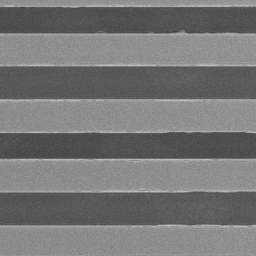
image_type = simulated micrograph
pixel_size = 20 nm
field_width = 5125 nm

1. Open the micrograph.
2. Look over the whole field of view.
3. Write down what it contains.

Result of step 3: lines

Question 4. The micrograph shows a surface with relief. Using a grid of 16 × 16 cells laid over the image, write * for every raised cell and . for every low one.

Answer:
................
................
****************
****************
................
................
****************
****************
................
................
****************
****************
................
................
****************
****************